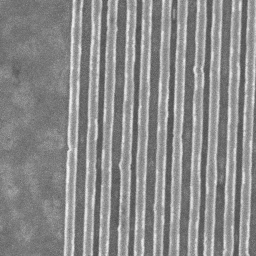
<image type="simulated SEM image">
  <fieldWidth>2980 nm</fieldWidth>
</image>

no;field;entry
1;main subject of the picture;parallel lines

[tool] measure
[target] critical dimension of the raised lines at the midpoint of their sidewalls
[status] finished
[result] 112 nm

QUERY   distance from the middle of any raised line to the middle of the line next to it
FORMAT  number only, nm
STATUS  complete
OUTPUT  204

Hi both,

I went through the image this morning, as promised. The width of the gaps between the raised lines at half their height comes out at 90.1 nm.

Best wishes